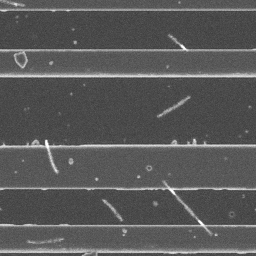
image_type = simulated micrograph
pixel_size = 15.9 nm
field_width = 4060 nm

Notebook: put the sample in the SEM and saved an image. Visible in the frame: lines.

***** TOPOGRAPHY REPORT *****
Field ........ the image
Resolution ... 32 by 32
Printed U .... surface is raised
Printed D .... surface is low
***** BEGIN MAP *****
UUUUUUUUUUUUUUUUUUUUUUUUUUUUUUUU
DDDDDDDDDDDDDDDDDDDDDDDDDDDDDDDD
DDDDDDDDDDDDDDDDDDDDDDDDDDDDDDDD
DDDDDDDDDDDDDDDDDDDDDDDDDDDDDDDD
DDDDDDDDDDDDDDDDDDDDDDDDDDDDDDDD
DDDDDDDDDDDDDDDDDDDDDDDDDDDDDDDD
UUUUUUUUUUUUUUUUUUUUUUUUUUUUUUUU
UUUUUUUUUUUUUUUUUUUUUUUUUUUUUUUU
UUUUUUUUUUUUUUUUUUUUUUUUUUUUUUUU
UDDDDDDDDDDDDDUUUUUUUDUUUUUUUDDU
DDDDDDDDDDDDDDDDDDDDDDDDDDDDDDDD
DDDDDDDDDDDDDDDDDDDDDDDDDDDDDDDD
DDDDDDDDDDDDDDDDDDDDDDDDDDDDDDDD
DDDDDDDDDDDDDDDDDDDDDDDDDDDDDDDD
DDDDDDDDDDDDDDDDDDDDDDDDDDDDDDDD
DDDDDDDDDDDDDDDDDDDDDDDDDDDDDDDD
DDDDDDDDDDDDDDDDDDDDDDDDDDDDDDDD
DDDDDDDDDDDDDDDDDDDDDDDDDDDDDDDD
UUUUUUUUUUUUUUUUUUUUUUUUUUUUUUUU
UUUUUUUUUUUUUUUUUUUUUUUUUUUUUUUU
UUUUUUUUUUUUUUUUUUUUUUUUUUUUUUUU
UUUUUUUUUUUUUUUUUUUUUUUUUUUUUUUU
UUUUUUUUUUUUUUUUUUUUUUUUUUUUUUUU
UUUUUUUUUUUUUUUUUUUUUUUUUUUUUUUU
DDDDDDDDDDDDDDDDDDDDDDDDDDDDDDDD
DDDDDDDDDDDDDDDDDDDDDDDDDDDDDDDD
DDDDDDDDDDDDDDDDDDDDDDDDDDDDDDDD
DDDDDDDDDDDDDDDDDDDDDDDDDDDDDDDD
UUUUUUUUUUUUUUUUUUUUUUUUUUUUUUUU
UUUUUUUUUUUUUUUUUUUUUUUUUUUUUUUU
UUUUUUUUUUUUUUUUUUUUUUUUUUUUUUUU
UUUUUUUUUUUUUUUUUUUUUUUUUUUUUUUU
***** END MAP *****